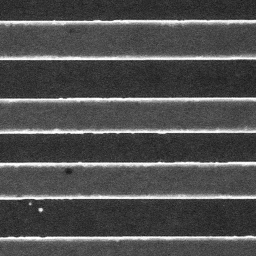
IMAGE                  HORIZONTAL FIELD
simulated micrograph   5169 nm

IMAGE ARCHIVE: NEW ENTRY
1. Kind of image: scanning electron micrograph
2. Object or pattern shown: lines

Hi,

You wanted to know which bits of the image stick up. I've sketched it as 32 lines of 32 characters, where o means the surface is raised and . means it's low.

................................
................................
................................
oooooooooooooooooooooooooooooooo
oooooooooooooooooooooooooooooooo
oooooooooooooooooooooooooooooooo
oooooooooooooooooooooooooooooooo
................................
................................
................................
................................
................................
.ooooooooooooooooooooooooooooooo
oooooooooooooooooooooooooooooooo
oooooooooooooooooooooooooooooooo
oooooooooooooooooooooooooooooooo
ooooooooooooooooooooooooooo.....
................................
................................
................................
.........oo.o..ooooooooooooooooo
oooooooooooooooooooooooooooooooo
oooooooooooooooooooooooooooooooo
oooooooooooooooooooooooooooooooo
oooooooooooooooooooooooooooooooo
................................
................................
................................
................................
................................
oooooooooooooooooooooooooooooooo
oooooooooooooooooooooooooooooooo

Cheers